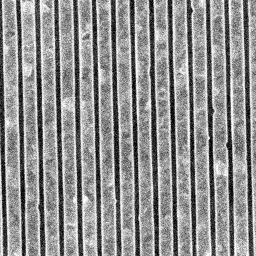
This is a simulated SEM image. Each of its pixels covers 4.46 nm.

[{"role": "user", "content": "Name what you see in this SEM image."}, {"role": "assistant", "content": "parallel lines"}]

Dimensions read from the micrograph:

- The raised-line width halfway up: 59 nanometers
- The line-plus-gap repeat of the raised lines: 84.2 nm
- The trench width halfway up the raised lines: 23.4 nm